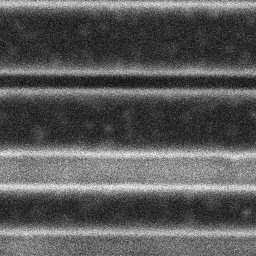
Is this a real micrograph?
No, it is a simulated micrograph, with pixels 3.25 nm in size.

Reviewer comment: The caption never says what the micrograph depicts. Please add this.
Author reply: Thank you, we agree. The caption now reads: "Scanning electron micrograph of one or a few lines or trenches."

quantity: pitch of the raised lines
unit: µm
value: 0.279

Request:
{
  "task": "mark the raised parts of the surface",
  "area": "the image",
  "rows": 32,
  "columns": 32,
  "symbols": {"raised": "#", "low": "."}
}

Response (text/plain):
################################
################################
################################
################################
################################
################################
################################
################################
################################
................................
................................
################################
################################
################################
################################
################################
################################
################################
################################
...........................#####
................................
................................
................................
################################
################################
################################
################################
################################
################################
................................
................................
................................